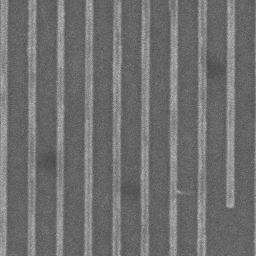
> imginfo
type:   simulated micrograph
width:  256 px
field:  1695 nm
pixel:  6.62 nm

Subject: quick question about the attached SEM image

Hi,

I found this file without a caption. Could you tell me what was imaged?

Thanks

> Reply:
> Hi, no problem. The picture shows parallel lines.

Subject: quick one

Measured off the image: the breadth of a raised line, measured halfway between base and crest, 0.0455 µm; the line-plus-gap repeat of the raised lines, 188 nm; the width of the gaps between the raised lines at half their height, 0.144 micrometres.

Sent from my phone